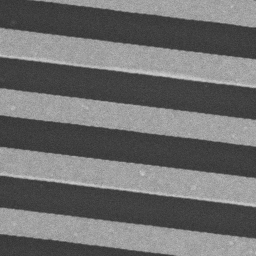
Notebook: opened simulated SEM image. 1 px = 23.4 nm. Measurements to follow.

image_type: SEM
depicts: lines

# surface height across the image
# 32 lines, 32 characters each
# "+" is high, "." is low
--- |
........++++++++++++++++++++++++
................++++++++++++++++
.........................+++++++
................................
++++++++........................
+++++++++++++++.................
+++++++++++++++++++++++.........
.....+++++++++++++++++++++++++++
............++++++++++++++++++++
.....................+++++++++++
............................++++
+++.............................
++++++++++++....................
++++++++++++++++++++............
.+++++++++++++++++++++++++++....
.........+++++++++++++++++++++++
.................+++++++++++++++
.........................+++++++
+...............................
+++++++++.......................
+++++++++++++++++...............
+++++++++++++++++++++++++.......
.....+++++++++++++++++++++++++++
..............++++++++++++++++++
......................++++++++++
..............................++
++++............................
++++++++++++....................
+++++++++++++++++++++...........
...++++++++++++++++++++++++++...
...........+++++++++++++++++++++
...................+++++++++++++